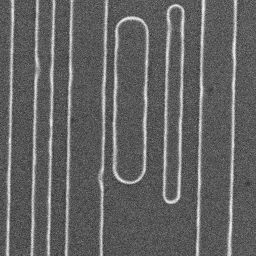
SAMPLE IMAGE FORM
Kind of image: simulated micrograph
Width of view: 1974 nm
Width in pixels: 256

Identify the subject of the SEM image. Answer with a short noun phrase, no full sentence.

groups of lines, slits or small figures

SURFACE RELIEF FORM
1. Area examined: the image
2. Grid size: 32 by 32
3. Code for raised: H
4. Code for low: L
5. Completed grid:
HHLLLHHLLHHHHLLLLLLLLLLLLHHHHLLL
HHLLLHHLLHHHHLLLLLLLLHHLLHHHHLLL
HHLLLHHLLHHHHLLHHHLLLHHLLHHHHLLL
HHLLLHHLLHHHHLLHHHLLLHHLLHHHHLLL
HLLLLHHLLHHHHLLHHHLLLHHLLHHHHLLL
HLLLLHHLLHHHHLLHHHLLLHHLLHHHHLLL
HLLLHHHLLHHHHLHHHHLLLHHLLHHHHLLL
HLLLLHHLLHHHHLHHHHLLLHHLLHHHHLLL
HLLLLHHLLHHHHLHHHHLLLHHLLHHHHLLL
HLLLLHLLLHHHHLHHHHLLLHHLLHHHHLLL
HLLLHHHLLHHHHLHHHHLLLHHLLHHHHLLL
HLLLHHHLLHHHHLHHHHLLLHHLLHHHHLLL
HLLLHHHLLHHHHLHHHHLLLHHLLHHHHLLL
HLLLHHLLLHHHHLHHHHLLLHHLLHHHHLLL
HLLLHHLLLHHHHLHHHHLLLHHLLHHHHLLL
HLLLHHLLLHHHHLHHHHLLLHHLLHHHHLLL
HLLLHHLLLHHHHLHHHHLLLHLLLHHHHLLL
HLLLHHLLLHHHHLHHHHLLLHLLLHHHHLLL
HLLLHHLLLHHHHLHHHHLLLHLLLHHHHLLL
HLLLHHLLHHHHHLHHHHLLLHLLLHHHHLLL
HLLLHHLLHHHHHLHHHHLLLHLLLHHHHLLL
HLLLHHLLHHHHHLHHHHLLLHLLLHHHHLLL
HLLLHHLLHHHHHLLHHLLLLHLLLHHHHLLL
HLLLHHLLHHHHHLLLLLLLLHLLLHHHHLLL
HLLLHHLLHHHHHLLLLLLLLHLLLHHHHLLL
HLLLHHLLHHHHHLLLLLLLLLLLLHHHHLLL
HLLLHHLLHHHHHLLLLLLLLLLLLHHHHLLL
HLLLHHLLHHHHHLLLLLLLLLLLLHHHHLLL
HLLLHHLLHHHHHLLLLLLLLLLLLHHHHLLL
HLLLHHLLHHHHHLLLLLLLLLLLLHHHHLLL
HLLLHHLLHHHHHLLLLLLLLLLLLHHHHLLL
HLLLHHLLHHHHHLLLLLLLLLLLLHHHHLLL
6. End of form